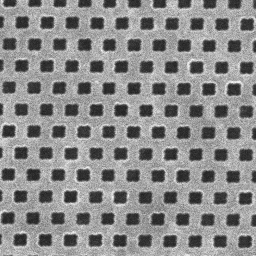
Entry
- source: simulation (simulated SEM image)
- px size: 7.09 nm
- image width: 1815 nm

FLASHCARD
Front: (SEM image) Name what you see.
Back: a regular array of holes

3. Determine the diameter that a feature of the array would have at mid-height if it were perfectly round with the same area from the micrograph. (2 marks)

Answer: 98.7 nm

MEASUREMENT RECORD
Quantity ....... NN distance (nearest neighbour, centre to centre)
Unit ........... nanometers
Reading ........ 175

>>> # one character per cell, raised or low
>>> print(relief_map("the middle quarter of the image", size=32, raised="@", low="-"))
----@@@---@@@---@@@---@@@----@@-
----@@----@@@---@@@---@@@----@@-
@@@@@@@@@@@@@@@@@@@@@@@@@@@@@@@@
@@@@@@@@@@@@@@@@@@@@@@@@@@@@@@@@
@@@@--@@@@@@@@@@@@@@@@@@@@@@@@@@
@@@----@@@---@@@---@@@----@@----
@@@----@@@---@@@---@@@---@@@----
@@@@--@@@@--@@@@---@@@---@@@---@
@@@@@@@@@@@@@@@@@@@@@@@@@@@@@@@@
@@@@@@@@@@@@@@@@@@@@@@@@@@@@@@@@
----@@@---@@@---@@@---@@@---@@@@
---@@@@---@@@---@@@---@@@----@@-
---@@@----@@----@@@---@@@----@@-
@@@@@@@@@@@@@@@@@@@@@@@@@@@@@@@@
@@@@@@@@@@@@@@@@@@@@@@@@@@@@@@@@
@@@@--@@@@--@@@@---@@@@@@@@@@@@@
@@@----@@@---@@@---@@@---@@@----
@@@----@@@---@@@---@@@---@@@----
@@@@--@@@@-@@@@@---@@@---@@@---@
@@@@@@@@@@@@@@@@@@@@@@@@@@@@@@@@
@@@@@@@@@@@@@@@@@@@@@@@@@@@@@@@@
----@@----@@@---@@@---@@@---@@@@
---@@@----@@@---@@@---@@@---@@@-
---@@@----@@@---@@@---@@@---@@@-
@@@@@@@@@@@@@@@@@@@@@@@@@@@@@@@@
@@@@@@@@@@@@@@@@@@@@@@@@@@@@@@@@
@@@---@@@@--@@@@---@@@---@@@@--@
@@@----@@----@@@---@@@---@@@---@
@@@----@@----@@@---@@@---@@@---@
@@@@@@@@@@@@@@@@-@@@@@-@@@@@@--@
@@@@@@@@@@@@@@@@@@@@@@@@@@@@@@@@
@@@@@@@@@@@@@@@@@@@@@@@@@@@@@@@@